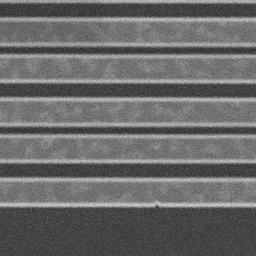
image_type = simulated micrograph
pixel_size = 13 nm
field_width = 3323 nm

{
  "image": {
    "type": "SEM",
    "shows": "parallel lines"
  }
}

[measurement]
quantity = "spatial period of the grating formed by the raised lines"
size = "520 nm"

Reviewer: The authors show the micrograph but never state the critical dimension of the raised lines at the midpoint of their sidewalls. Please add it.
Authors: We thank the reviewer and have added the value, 24.6 pixels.